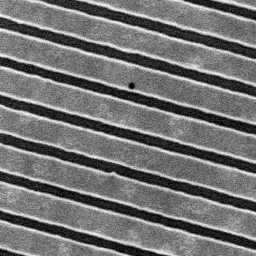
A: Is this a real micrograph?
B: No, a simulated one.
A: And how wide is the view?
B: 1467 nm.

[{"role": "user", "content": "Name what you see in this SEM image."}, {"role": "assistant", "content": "parallel lines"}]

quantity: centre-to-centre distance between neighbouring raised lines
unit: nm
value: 212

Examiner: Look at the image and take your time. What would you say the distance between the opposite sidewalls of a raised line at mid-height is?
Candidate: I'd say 151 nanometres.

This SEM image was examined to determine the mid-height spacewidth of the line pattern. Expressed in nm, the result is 64.3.